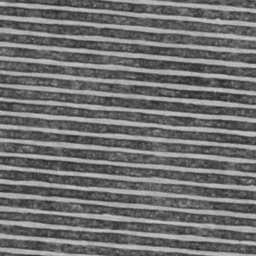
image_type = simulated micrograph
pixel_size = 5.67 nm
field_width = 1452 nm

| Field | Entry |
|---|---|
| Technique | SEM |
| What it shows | parallel lines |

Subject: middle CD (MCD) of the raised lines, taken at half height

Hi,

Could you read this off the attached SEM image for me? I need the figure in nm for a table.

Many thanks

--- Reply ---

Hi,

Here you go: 20.5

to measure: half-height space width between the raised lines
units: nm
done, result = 55.8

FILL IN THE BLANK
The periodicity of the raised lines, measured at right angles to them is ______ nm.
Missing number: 77.3